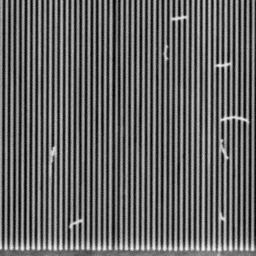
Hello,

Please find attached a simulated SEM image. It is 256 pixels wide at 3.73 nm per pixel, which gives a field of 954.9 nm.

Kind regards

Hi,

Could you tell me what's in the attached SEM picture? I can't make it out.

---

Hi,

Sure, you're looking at parallel lines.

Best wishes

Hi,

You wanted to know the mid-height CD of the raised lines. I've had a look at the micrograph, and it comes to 10.3 nanometres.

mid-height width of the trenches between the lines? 0.0103 µm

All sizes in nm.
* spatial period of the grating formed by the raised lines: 20.5